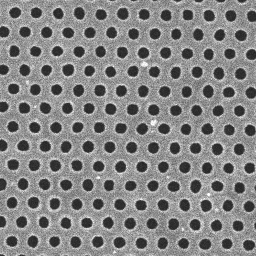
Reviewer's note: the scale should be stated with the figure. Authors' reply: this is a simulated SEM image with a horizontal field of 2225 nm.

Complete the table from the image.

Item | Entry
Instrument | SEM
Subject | a regular array of holes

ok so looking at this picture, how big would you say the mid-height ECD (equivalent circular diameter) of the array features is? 0.099 µm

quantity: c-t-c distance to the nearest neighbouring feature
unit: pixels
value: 21.2